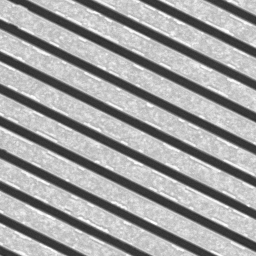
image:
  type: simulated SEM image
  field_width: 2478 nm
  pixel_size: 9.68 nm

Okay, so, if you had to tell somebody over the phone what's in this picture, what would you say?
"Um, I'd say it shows parallel lines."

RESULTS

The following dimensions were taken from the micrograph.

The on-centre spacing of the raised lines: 0.281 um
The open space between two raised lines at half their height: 86.8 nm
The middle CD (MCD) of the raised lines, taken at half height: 0.192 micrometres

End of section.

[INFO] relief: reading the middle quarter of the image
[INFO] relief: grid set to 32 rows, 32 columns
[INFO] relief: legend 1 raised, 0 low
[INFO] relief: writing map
11100000111111111110000011111111
11111000001111111111100000111111
11111110000011111111111000001111
11111111100000111111111110000011
11111111111000001111111111100000
00111111111110000011111111111000
00001111111111100000111111111110
10000011111111111000001111111111
11000000111111111110000011111111
11111000001111111111100000111111
11111110000011111111111000001111
11111111000000111111111110000011
11111111111000001111111111100000
01111111111110000011111111111000
00011111111111100000111111111110
00000111111111110000001111111111
11000001111111111100000011111111
11110000001111111111000000111111
11111100000011111111111000001111
11111111000000111111111110000011
11111111110000001111111111100000
01111111111100000011111111111000
00011111111111000000111111111110
00000111111111110000001111111111
11000001111111111100000011111111
11110000011111111111000000111111
11111100000111111111110000001111
11111111000000111111111100000011
11111111110000001111111111100000
01111111111100000011111111111000
00011111111111000000111111111110
00000111111111110000001111111111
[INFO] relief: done